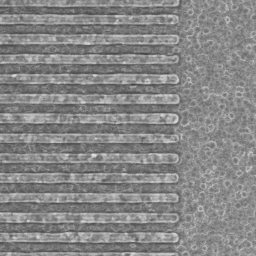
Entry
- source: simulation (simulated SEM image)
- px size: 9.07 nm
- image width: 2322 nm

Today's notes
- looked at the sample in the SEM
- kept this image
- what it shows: parallel lines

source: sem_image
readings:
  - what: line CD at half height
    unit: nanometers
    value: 72.6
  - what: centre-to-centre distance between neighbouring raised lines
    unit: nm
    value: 180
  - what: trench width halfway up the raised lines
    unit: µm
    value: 0.104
